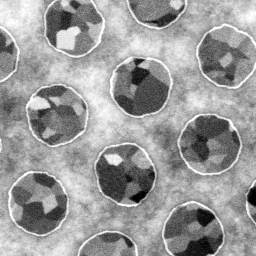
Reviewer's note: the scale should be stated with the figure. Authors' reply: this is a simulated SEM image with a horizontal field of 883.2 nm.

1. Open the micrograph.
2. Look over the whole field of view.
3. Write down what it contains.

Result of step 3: raised bodies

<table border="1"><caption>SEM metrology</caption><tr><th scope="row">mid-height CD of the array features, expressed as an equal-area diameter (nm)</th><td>212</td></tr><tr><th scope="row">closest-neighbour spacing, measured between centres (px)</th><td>88.9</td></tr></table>